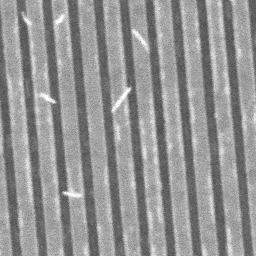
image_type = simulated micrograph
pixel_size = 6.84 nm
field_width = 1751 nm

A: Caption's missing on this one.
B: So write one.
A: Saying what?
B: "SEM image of parallel lines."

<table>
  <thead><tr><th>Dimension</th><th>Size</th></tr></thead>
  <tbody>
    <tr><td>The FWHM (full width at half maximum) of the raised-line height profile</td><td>101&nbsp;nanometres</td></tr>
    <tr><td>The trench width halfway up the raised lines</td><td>0.0758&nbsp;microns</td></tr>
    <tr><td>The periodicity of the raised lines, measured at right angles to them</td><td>175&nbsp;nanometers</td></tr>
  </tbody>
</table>